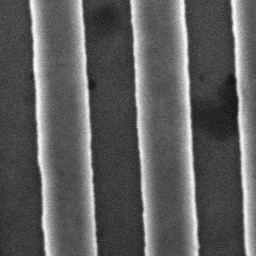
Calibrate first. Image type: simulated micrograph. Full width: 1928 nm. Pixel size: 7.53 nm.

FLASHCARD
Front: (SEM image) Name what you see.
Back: lines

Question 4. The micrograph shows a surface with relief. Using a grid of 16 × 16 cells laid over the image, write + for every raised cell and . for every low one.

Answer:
..+++...+++....+
..+++...++++...+
..+++...++++...+
..+++...++++...+
..+++...++++...+
..+++....+++...+
..++++...+++...+
..++++...+++...+
..++++...+++...+
..++++...+++...+
...+++...+++...+
...+++...+++...+
...+++...+++...+
...+++...+++...+
...+++...+++...+
...+++...+++...+